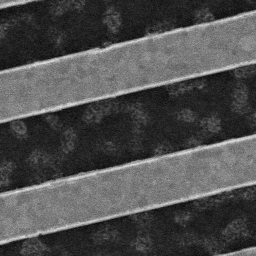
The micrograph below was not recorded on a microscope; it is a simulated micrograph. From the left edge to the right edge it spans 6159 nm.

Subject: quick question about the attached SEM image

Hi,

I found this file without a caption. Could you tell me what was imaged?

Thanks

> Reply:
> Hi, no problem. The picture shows one or a few lines or trenches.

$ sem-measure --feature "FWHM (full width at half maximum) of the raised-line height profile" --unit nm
1110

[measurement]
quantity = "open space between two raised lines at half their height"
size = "1750 nm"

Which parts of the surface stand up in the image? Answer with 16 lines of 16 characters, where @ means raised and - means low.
----------------
-------------@@@
---------@@@@@@@
-----@@@@@@@@@@@
@@@@@@@@@@@@@---
@@@@@@@@@-------
@@@@@-----------
----------------
----------------
------------@@@@
-------@@@@@@@@@
---@@@@@@@@@@@@-
@@@@@@@@@@@-----
@@@@@@@---------
@@@-------------
----------------